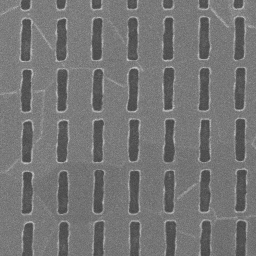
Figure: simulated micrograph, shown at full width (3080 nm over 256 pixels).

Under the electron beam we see a regular array of holes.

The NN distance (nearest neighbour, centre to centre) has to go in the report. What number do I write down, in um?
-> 0.427